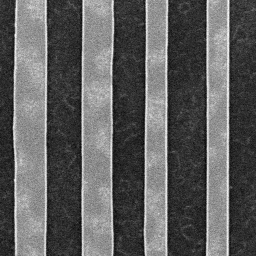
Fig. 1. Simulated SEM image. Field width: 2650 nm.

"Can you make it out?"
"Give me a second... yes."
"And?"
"one or a few lines or trenches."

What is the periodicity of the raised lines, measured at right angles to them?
0.646 micrometres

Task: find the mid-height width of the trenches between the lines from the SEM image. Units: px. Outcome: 36.8